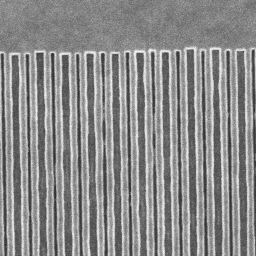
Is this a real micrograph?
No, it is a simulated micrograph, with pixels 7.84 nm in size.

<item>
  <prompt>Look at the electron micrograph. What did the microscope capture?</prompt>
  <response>parallel lines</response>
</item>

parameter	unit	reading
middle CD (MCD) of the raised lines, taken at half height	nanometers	53.9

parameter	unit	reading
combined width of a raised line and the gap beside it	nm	99.2